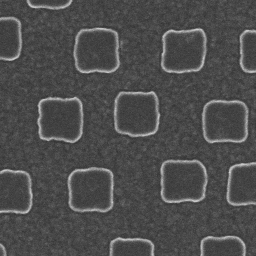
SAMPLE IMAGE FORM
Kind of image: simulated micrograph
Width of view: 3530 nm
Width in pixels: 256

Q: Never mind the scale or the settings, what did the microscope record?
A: raised bodies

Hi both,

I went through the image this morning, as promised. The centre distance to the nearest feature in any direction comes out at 1030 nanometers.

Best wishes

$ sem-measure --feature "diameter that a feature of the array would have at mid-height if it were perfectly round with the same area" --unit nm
652